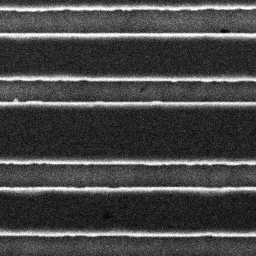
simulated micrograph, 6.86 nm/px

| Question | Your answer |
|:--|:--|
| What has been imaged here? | lines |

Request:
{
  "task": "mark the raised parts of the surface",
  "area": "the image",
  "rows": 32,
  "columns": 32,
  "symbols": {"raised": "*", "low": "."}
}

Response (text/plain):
********************************
................................
................................
................................
********************************
********************************
********************************
********************************
********************************
********************************
................................
................................
................................
********************************
********************************
********************************
********************************
********************************
********************************
********************************
..................*..........*..
................................
................................
......**............*...........
********************************
********************************
********************************
********************************
********************************
................................
................................
................................